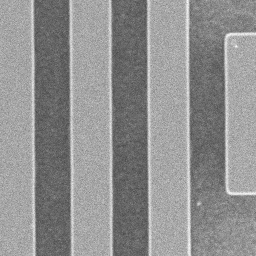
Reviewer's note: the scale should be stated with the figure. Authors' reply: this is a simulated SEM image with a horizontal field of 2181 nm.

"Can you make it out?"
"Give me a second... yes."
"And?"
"groups of lines, slits or small figures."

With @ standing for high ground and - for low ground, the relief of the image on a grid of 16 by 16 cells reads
@@--@@@--@@@----
@@--@@@--@@@----
@@--@@@--@@@--@@
@@--@@@--@@@--@@
@@--@@@--@@@--@@
@@--@@@--@@@--@@
@@--@@@--@@@--@@
@@--@@@--@@@--@@
@@--@@@--@@@--@@
@@--@@@--@@@--@@
@@--@@@--@@@--@@
@@--@@@--@@@--@@
@@--@@@--@@@----
@@--@@@--@@@----
@@--@@@--@@@----
@@--@@@--@@@----